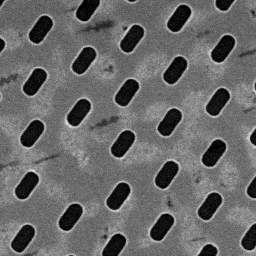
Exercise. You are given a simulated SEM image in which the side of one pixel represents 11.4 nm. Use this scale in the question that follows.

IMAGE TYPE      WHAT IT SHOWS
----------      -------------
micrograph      a regular array of holes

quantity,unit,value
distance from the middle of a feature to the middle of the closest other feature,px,51.8